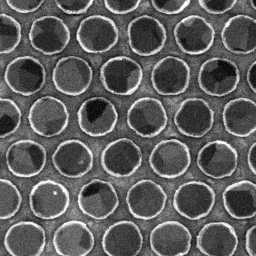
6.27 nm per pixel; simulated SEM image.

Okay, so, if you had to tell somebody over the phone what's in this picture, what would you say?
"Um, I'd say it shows a regular array of raised bodies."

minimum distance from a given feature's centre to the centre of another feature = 297 nanometres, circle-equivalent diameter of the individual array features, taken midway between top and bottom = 238 nm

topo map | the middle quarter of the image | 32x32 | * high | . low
******....*********....********.
*******..**********...*********.
*******..**********...*********.
*******..**********...*********.
******....*********...*********.
******....********.....********.
*****......******......*******..
.***...........*........****....
........*.......................
.....******.......******......**
.....*******.....*******.....***
....*********...*********....***
*...*********...*********...****
*...*********...**********..****
*...*********...**********..****
....********....*********...****
.....*******.....*******.....***
......****.........****.......**
................................
****.........****........****...
*****......*******.....*******..
******....*********...*********.
*******...*********...*********.
*******...*********...*********.
*******...*********...*********.
*******...*********...*********.
******....********.....*******..
*****.......*****......******...
................................
.......***.........***..........
.....*******......******......**
....*********...*********....***